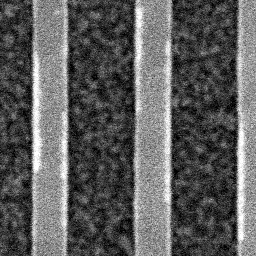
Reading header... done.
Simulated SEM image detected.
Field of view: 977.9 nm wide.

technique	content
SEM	one or a few lines or trenches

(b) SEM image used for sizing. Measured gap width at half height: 262 nm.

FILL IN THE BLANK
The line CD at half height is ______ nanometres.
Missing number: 126